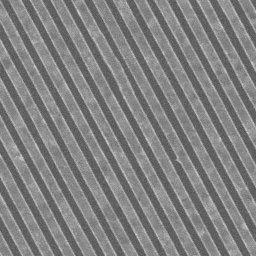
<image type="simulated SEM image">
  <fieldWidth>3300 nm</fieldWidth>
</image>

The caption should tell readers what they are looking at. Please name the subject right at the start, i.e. parallel lines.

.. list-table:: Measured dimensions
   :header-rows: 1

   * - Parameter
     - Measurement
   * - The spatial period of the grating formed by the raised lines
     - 236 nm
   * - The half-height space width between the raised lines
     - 108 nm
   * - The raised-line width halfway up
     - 126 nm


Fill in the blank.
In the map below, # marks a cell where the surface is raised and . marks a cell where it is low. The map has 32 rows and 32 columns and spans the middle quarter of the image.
.##...##...###..###..###...##...
.###..###...###..##...###..###..
..##...##...###..###..###...##..
..###..###...###..##...###..###.
...##...###..###..###..###...##.
#..###..###...###..##...###..###
#...##...###..###..###...##...##
##..###..###...###..###..###..##
##...###..###..###..###...##...#
###..###...##...###..###..###..#
.##...###..###..###..###...##...
.###..###...##...###..###..###..
..##...###..###..###...##...###.
..###...##...##...###..###..###.
...###..###..###..###...##...###
#..###...##...##...###..###...##
#...###..###..###...##...##...##
##...##...##...###..###..###...#
###..###..###..###...##...##...#
###...##...##...###..###..###...
.###..###..###..###...##...###..
.###...##...###..###..###..###..
..###..###..#.#...##...##...###.
..###...##...###..###..###..###.
#..###..###..###...##...###..###
#..###...##...###..###..###...##
##..###..###...##...##...###..##
##...##...###..###..###..###...#
###..###..###...##...##...###..#
###...##...###..###..###..###...
.###..###...##...##...###..###..
.###...##...###..###..###...##..